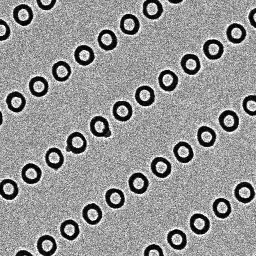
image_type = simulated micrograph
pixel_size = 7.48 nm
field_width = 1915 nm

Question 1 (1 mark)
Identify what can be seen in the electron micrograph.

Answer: a regular array of ring-shaped grooves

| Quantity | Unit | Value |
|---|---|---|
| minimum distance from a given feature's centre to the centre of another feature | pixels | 27.4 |